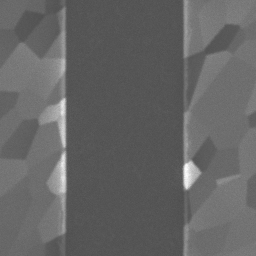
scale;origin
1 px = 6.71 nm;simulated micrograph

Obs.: one or a few lines or trenches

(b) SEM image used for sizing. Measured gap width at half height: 817 nanometers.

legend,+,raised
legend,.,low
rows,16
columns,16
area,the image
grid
++++........++++
++++........++++
++++........++++
++++........++++
++++........++++
++++........++++
++++........++++
++++........++++
++++........++++
++++........++++
++++........++++
++++........++++
++++........++++
++++........++++
++++........++++
++++........++++